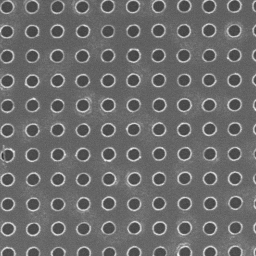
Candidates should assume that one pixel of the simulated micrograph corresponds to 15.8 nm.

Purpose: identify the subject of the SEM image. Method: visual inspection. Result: a regular array of holes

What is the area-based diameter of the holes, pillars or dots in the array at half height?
187 nm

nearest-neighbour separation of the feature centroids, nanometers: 386